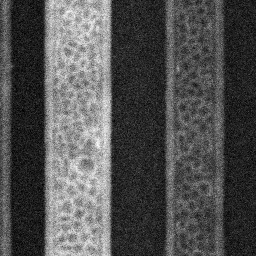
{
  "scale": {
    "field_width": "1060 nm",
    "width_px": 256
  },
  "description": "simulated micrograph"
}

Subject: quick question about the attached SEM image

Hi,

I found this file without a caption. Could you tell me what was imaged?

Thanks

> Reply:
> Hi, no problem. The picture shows one or a few lines or trenches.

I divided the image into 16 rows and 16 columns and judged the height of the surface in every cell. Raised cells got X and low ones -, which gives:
---XXXX----XXX--
---XXXX----XXX--
---XXXX----XXX--
---XXXX----XXX--
---XXXX----XXX--
---XXXX----XXX--
---XXXX----XXX--
---XXXX----XXX--
---XXXX----XXX--
---XXXX----XXX--
---XXXX----XXX--
---XXXX----XXX--
---XXXX----XXX--
---XXXX----XXX--
---XXXX----XXX--
---XXXX----XXX--